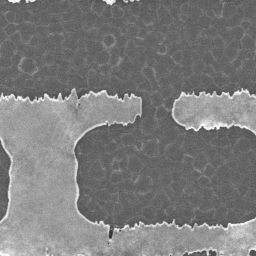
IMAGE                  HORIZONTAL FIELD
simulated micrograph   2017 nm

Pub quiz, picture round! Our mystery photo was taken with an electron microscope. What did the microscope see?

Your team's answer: one or a few lines or trenches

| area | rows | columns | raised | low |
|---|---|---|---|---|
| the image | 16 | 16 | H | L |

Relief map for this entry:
LLLLLLLLLLLLLLLL
LLLLLLLLLLLLLLLL
LLLLLLLLLLLLLLLL
LLLLLLLLLLLLLLLL
LLLLLLLLLLLLLLLL
LLLLLLLLLLLLLLLL
HHHHHHHHHLLHHHHH
HHHHHHHHLLLHHHHH
HHHHHLLLLLLLLLLL
HHHHHLLLLLLLLLLL
LHHHHLLLLLLLLLLL
LHHHHLLLLLLLLLLL
LHHHHLLLLLLLLLLL
HHHHHLLLLLLLLLLL
HHHHHHHHHHHHHHHH
HHHHHHHHHHHHHHHH